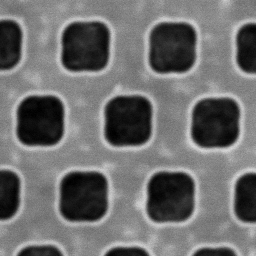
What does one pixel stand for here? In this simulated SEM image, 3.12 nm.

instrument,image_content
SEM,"holes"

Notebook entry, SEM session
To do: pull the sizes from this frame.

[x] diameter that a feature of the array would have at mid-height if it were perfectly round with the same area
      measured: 168 nanometers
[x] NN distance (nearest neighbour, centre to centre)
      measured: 0.271 microns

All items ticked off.